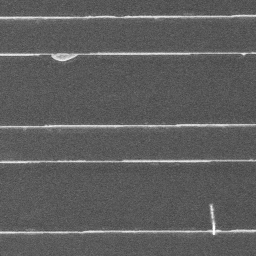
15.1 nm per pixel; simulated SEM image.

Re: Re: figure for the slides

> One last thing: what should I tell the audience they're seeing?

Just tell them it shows lines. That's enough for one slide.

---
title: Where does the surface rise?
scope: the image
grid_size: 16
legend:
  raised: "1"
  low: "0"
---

0000000000000000
1111111111111111
1111111111111111
0001100000000000
0000000000000000
0000000000000000
0000000000000000
0000000000000000
1111111111111111
1111111111111111
0000000000000000
0000000000000000
0000000000000000
0000000000000000
0000011111111111
1111111111111111